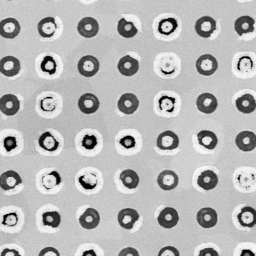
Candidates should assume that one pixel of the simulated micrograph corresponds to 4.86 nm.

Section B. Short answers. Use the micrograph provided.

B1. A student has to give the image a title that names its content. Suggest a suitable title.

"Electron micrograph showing a regular array of ring-shaped grooves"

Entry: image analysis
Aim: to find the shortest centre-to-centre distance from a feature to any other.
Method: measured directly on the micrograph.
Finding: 184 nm